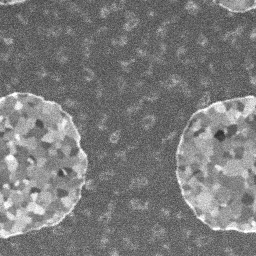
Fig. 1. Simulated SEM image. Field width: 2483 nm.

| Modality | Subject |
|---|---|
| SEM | raised bodies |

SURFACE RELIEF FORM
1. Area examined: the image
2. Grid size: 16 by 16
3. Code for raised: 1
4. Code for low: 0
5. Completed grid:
0000000000000011
0000000000000000
0000000000000000
0000000000000000
0000000000000000
0000000000000000
1110000000000111
1111000000001111
1111100000011111
1111100000011111
1111100000011111
1111100000011111
1111100000001111
1111000000001111
1100000000000000
0000000000000000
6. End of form